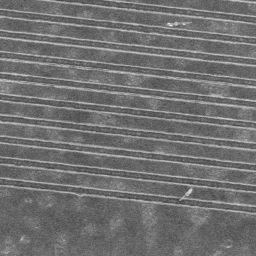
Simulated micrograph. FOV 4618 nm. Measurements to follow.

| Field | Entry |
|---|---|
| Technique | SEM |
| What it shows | parallel lines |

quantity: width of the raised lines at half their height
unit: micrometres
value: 0.258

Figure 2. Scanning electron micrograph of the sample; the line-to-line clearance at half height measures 121 nm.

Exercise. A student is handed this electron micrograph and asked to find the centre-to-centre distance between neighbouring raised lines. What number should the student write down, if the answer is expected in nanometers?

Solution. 378